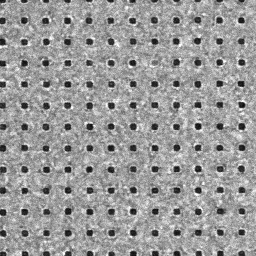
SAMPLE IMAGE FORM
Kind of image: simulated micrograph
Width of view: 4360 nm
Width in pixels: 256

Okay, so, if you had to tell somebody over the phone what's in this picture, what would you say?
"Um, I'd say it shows a regular array of holes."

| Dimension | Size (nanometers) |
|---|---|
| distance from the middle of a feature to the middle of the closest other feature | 359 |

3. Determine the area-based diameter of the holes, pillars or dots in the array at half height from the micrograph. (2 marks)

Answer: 127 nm